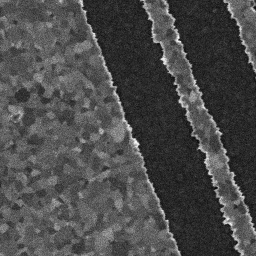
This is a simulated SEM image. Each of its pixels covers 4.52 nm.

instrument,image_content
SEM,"one or a few lines or trenches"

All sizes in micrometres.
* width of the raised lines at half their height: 0.0942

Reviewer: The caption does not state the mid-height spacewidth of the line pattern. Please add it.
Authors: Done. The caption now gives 0.263 µm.